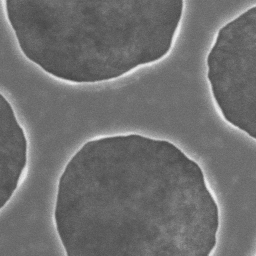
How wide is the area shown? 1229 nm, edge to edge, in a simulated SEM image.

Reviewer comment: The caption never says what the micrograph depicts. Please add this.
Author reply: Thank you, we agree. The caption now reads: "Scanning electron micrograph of holes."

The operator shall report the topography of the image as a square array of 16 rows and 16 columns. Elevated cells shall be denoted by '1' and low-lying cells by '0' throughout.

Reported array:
0000000000011111
1000000000011100
1000000000011000
1100000000111000
1110000011111000
1111111111111000
0111111111111100
0111111111111100
0011111001111111
0011100000011111
0011000000001111
0111000000000111
1111000000000111
1110000000000011
1111000000000011
1111000000000111